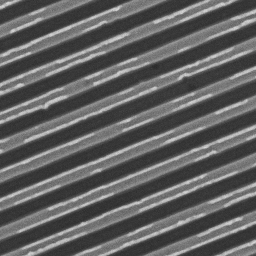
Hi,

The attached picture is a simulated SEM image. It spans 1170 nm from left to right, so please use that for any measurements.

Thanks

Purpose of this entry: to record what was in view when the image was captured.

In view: parallel lines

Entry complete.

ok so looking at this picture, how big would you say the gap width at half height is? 0.062 µm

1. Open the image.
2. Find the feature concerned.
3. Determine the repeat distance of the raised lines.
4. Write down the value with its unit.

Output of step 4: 122 nm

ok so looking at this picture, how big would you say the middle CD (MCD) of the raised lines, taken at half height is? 62 nm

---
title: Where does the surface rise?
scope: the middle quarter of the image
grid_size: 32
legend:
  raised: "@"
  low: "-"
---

@@@---------@@@@@@@@@---------@@
@--------@@@@@@@@@----------@@@@
-------@@@@@@@@----------@@@@@@@
----@@@@@@@@@---------@@@@@@@@--
--@@@@@@@@@--------@@@@@@@@@----
@@@@@@@@---------@@@@@@@@@------
@@@@@@---------@@@@@@@@---------
@@@@--------@@@@@@@@@----------@
@---------@@@@@@@@----------@@@@
--------@@@@@@@@----------@@@@@@
-----@@@@@@@@----------@@@@@@@@@
---@@@@@@@@----------@@@@@@@@---
-@@@@@@@@---------@@@@@@@@@-----
@@@@@@----------@@@@@@@@--------
@@@@---------@@@@@@@@@---------@
@@---------@@@@@@@@----------@@@
--------@@@@@@@@@----------@@@@@
------@@@@@@@@----------@@@@@@@@
---@@@@@@@@@----------@@@@@@@@--
-@@@@@@@@@---------@@@@@@@@-----
@@@@@@@---------@@@@@@@@@-------
@@@@@---------@@@@@@@@@---------
@@----------@@@@@@@@---------@@@
---------@@@@@@@@@---------@@@@@
-------@@@@@@@@---------@@@@@@@@
----@@@@@@@@@---------@@@@@@@@--
-@@@@@@@@@---------@@@@@@@@@----
@@@@@@@@---------@@@@@@@@-------
@@@@@---------@@@@@@@@@---------
@@@---------@@@@@@@@@---------@@
---------@@@@@@@@@---------@@@@@
-------@@@@@@@@@---------@@@@@@@